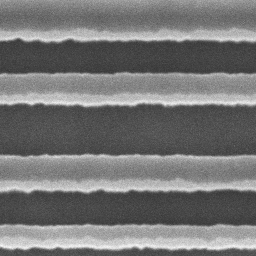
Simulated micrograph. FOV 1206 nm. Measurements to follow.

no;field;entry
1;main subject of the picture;lines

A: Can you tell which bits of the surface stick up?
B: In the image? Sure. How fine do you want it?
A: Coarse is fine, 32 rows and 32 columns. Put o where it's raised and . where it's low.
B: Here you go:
oooooooooooooooooooooooooooooooo
oooooooooooooooooooooooooooooooo
oooooooooooooooooooooooooooooooo
oooooooooooooooooooooooooooooooo
oooooooooooooooooooooooooooooooo
................................
................................
................................
................................
oooooooooooooooooooooooooooooooo
oooooooooooooooooooooooooooooooo
oooooooooooooooooooooooooooooooo
oooooooooooooooooooooooooooooooo
................................
................................
................................
................................
................................
................................
oo...ooooooooo.ooooo.ooo......oo
oooooooooooooooooooooooooooooooo
oooooooooooooooooooooooooooooooo
oooooooooooooooooooooooooooooooo
oooooooooooooooooooooooooooooooo
................................
................................
................................
................................
oooooooooooooooooooooooooooooooo
oooooooooooooooooooooooooooooooo
oooooooooooooooooooooooooooooooo
................................